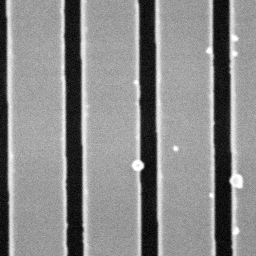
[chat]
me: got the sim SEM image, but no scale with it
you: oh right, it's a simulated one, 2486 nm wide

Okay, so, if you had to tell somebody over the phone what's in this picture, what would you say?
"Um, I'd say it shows lines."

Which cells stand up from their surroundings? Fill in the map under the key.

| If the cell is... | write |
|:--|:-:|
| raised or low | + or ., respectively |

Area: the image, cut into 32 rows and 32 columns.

.+++++++..+++++++..++++++++..+++
.+++++++..+++++++...+++++++..+++
.+++++++..+++++++...+++++++..+++
.+++++++..+++++++...+++++++..+++
.+++++++..+++++++...+++++++..+++
.+++++++..+++++++...+++++++..+++
.+++++++..+++++++...+++++++..+++
.+++++++..+++++++...+++++++..+++
.+++++++..+++++++...+++++++..+++
.+++++++..+++++++...+++++++..+++
.+++++++..+++++++...+++++++..+++
.+++++++..+++++++...+++++++..+++
.+++++++..+++++++...+++++++..+++
.+++++++..+++++++...+++++++..+++
.+++++++..+++++++...+++++++..+++
.+++++++..+++++++...+++++++..+++
.+++++++..+++++++...+++++++..+++
.+++++++..+++++++...+++++++..+++
.+++++++..+++++++...+++++++..+++
.+++++++..+++++++...+++++++..+++
.+++++++..++++++++..+++++++..+++
.+++++++..++++++++..+++++++..+++
.+++++++..+++++++...+++++++..+++
.+++++++..++++++++..+++++++..+++
.+++++++...+++++++..+++++++..+++
.+++++++...+++++++..+++++++..+++
.+++++++...+++++++..+++++++..+++
.+++++++...+++++++..+++++++..+++
.+++++++...+++++++..+++++++..+++
.+++++++...+++++++..+++++++..+++
.+++++++...+++++++..+++++++..+++
.+++++++...+++++++..+++++++..+++